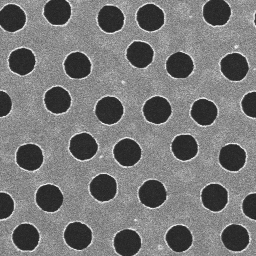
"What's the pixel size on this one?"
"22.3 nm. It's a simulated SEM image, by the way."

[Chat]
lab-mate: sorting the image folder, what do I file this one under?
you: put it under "a regular array of holes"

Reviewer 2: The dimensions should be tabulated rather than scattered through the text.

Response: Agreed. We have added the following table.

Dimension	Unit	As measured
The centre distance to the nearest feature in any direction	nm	980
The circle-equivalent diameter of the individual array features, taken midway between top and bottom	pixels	27.5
